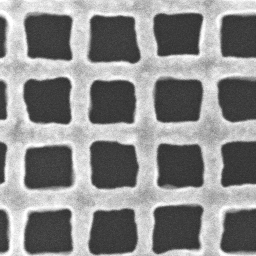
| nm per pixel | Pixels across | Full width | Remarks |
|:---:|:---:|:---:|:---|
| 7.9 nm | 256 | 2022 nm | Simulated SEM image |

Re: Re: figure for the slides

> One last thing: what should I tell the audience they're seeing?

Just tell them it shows a regular array of holes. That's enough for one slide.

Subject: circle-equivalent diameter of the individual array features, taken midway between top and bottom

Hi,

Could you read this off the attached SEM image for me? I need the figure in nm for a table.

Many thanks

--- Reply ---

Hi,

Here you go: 411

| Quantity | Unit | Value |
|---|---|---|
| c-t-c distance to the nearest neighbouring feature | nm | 500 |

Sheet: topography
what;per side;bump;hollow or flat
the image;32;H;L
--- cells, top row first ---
HHHHHHHHHHHHHHHHHHHHHHHHHHHHHHHH
HHHLLLHHHHHHHHHHHHHHHHHHHHHHHHHH
LHHLLLLLLHHLLLLLLHHLLLLLLHHHLLLL
LHHLLLLLLHHLLLLLLHHLLLLLLHHHLLLL
LHHLLLLLLHHLLLLLLHHLLLLLLHHLLLLL
LHHLLLLLLHHLLLLLLHHHLLLLLHHLLLLL
LHHLLLLLLHHLLLLLLLHHLLLLLHHHLLLL
HHHHHHLLLHHLLLLLLHHHHHHHHHHHHHHH
HHHHHHHHHHHHHHHHHHHHHHHHHHHHHHHH
HHHHHHHHHHHHHHHHHHHHHHHHHHHHHLLL
LHHLLLLLLHHLLLLLLHHLLLLLLHHLLLLL
LHHLLLLLLHHLLLLLLHHLLLLLLHHLLLLL
LHHLLLLLLHHLLLLLLHHLLLLLLHHLLLLL
LHHLLLLLLHHLLLLLLHHLLLLLLHHLLLLL
LHHHLLLLLHHLLLLLLHHLLLLLLHHHLLLL
HHHHHLHLHHHHLLHHHHHHHHHHHHHHHHHH
HHHHHHHHHHHHHHHHHHHHHHHHHHHHHHHH
HHHHHHHHHHHHHHHHHHHHHHHHHHHHHHHH
LHHHLLLLLHHLLLLLLHHHLLLLLHHHLLLL
LHHLLLLLLHHLLLLLLHHLLLLLLHHHLLLL
LHHLLLLLLHHLLLLLLHHHLLLLLLHHLLLL
LHHLLLLLLHHLLLLLLHHHLLLLLLHHLLLL
LHHLLLLLLLHLLLLLLHHHLLLLLLHHLLLL
HHHLLLLLHHHHLLLHHHHHLLLHHHHHHHHH
HHHHHHHHHHHHHHHHHHHHHHHHHHHHHHHH
HHHHHHHHHHHHHHHHHHHHHHHLLHHHHHHH
LHHHLLLLLHHHLLLLLHHLLLLLLHHHLLLL
LHHLLLLLLHHHLLLLLHHLLLLLLHHHLLLL
LHHLLLLLLHHLLLLLLHHLLLLLLHHHLLLL
LHHLLLLLLHHLLLLLLHHLLLLLLHHHLLLL
LHHLLLLLLHHLLLLLLHHLLLLLLHHHLLLL
LHHLLLLLLHHLLLLLLHHLLHHHHHHHLLLL